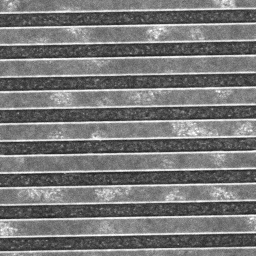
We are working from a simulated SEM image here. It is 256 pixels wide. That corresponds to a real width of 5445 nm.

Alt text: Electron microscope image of parallel lines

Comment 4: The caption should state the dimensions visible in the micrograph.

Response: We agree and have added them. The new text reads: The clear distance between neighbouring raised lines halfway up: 311 nm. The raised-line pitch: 681 nm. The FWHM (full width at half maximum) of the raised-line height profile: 370 nanometers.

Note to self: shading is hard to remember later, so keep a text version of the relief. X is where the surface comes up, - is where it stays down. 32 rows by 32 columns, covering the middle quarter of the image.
XXXXXXXXXXXXXXXXXXXXXXXXXXXXXXXX
XXXXXXXXXXXXXXXXXXXXXXXXXXXXXXXX
XXXXXXXXXXXXXXXXXXXXXX----------
--------------------------------
--------------------------------
--------------------------------
----------------XXXXXXXXXXXXXXXX
XXXXXXXXXXXXXXXXXXXXXXXXXXXXXXXX
XXXXXXXXXXXXXXXXXXXXXXXXXXXXXXXX
XXXXXXXXXXXXXXXXXXXXXXXXXXXXXXXX
XXXXXXXXXXXXXXXXXXXXXX----------
--------------------------------
--------------------------------
--------------------------------
-----------------XXXXXXXXXXXXXXX
XXXXXXXXXXXXXXXXXXXXXXXXXXXXXXXX
XXXXXXXXXXXXXXXXXXXXXXXXXXXXXXXX
XXXXXXXXXXXXXXXXXXXXXXXXXXXXXXXX
XXXXXXXXXXXXXXXXXXXXXX----------
--------------------------------
--------------------------------
--------------------------------
-----------------XXXXXXXXXXXXXXX
XXXXXXXXXXXXXXXXXXXXXXXXXXXXXXXX
XXXXXXXXXXXXXXXXXXXXXXXXXXXXXXXX
XXXXXXXXXXXXXXXXXXXXXXXXXXXXXXXX
XXXXXXXXXXXXXXXXXXXXXX----------
--------------------------------
--------------------------------
--------------------------------
-----------------XXXXXXXXXXXXXXX
XXXXXXXXXXXXXXXXXXXXXXXXXXXXXXXX